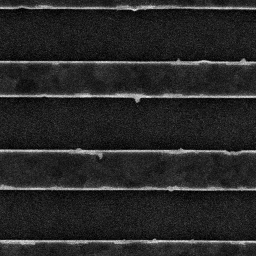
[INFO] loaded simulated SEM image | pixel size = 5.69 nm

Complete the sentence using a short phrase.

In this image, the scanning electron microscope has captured one or a few lines or trenches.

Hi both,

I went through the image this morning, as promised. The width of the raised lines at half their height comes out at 0.211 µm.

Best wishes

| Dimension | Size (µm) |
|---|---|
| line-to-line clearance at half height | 0.302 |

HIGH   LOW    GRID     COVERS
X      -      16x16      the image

X-XX--XXXX------
----------------
----------------
----------------
XXXXXXXXXXXXXXXX
XXXXXXXXXXXXXXXX
----------------
----------------
----------------
XXXXXXXXXXXXXXXX
XXXXXXXXXXXXXXXX
XXXXXXXXXXXXXXXX
----------------
----------------
----------------
XXXXXXXXXXXXXXXX